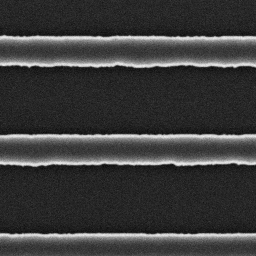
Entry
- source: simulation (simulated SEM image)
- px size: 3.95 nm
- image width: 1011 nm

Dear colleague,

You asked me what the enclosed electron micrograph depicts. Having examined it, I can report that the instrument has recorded lines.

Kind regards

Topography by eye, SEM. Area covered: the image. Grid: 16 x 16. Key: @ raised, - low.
----------------
----------------
@@@@@@@@@@@@@@@@
@@@@@@@@@@@@@@@@
----------------
----------------
----------------
----------------
@@@@@@@@@@@@@@@@
@@@@@@@@@@@@@@@@
----------------
----------------
----------------
----------------
----------------
@@@@@@@@@@@@@@@@